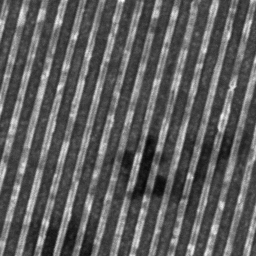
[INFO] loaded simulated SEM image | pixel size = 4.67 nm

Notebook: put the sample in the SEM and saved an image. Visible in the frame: parallel lines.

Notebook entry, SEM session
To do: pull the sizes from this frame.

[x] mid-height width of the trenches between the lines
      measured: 12.1 pixels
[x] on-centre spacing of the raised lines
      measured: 85.7 nanometres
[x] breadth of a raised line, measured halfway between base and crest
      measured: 28.2 nm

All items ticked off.